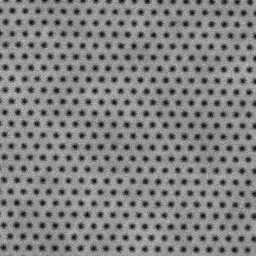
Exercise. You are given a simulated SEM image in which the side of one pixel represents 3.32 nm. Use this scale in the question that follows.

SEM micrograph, a regular array of holes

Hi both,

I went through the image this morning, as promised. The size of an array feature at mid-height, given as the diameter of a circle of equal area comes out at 20.9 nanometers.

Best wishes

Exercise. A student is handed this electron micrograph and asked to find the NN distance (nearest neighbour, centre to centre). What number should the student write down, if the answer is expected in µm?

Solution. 0.042